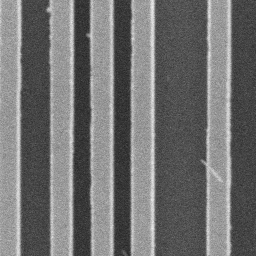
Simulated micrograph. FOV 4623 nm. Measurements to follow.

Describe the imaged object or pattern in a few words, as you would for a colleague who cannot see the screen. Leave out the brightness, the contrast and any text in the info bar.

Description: lines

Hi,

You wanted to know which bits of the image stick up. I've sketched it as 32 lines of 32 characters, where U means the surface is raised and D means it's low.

UUDDDDUUUDDUUUDDDUUDDDDDDDUUUDDD
UUDDDDUUUDDUUUDDDUUDDDDDDDUUUDDD
UUDDDDUUUDDUUUDDDUUDDDDDDDUUUDDD
UUDDDDUUUDDUUUDDUUUDDDDDDDUUUDDD
UUDDDDUUUDDUUUDDUUUDDDDDDDUUUDDD
UUDDDDUUUDDUUUDDDUUDDDDDDDUUUDDD
UUDDDDUUUDDUUUDDDUUDDDDDDDUUUDDD
UUDDDDUUUDDUUUDDUUUDDDDDDDUUUDDD
UUDDDDUUUDDUUUDDUUUDDDDDDDUUUDDD
UUDDDDUUUDDUUUDDUUUDDDDDDDUUUDDD
UUDDDDUUUDDUUUDDUUUDDDDDDDUUUDDD
UUDDDDUUUDDUUUDDUUUDDDDDDDUUUDDD
UUDDDDUUUDDUUUDDUUUDDDDDDDUUUDDD
UUDDDDUUUDDUUUDDUUUDDDDDDDUUUDDD
UUDDDDUUUDDUUUDDUUUDDDDDDDUUUDDD
UUDDDDUUUDDUUUDDUUUDDDDDDDUUUDDD
UUDDDDUUUDDUUUDDUUUDDDDDDDUUUDDD
UUDDDDUUUDDUUUDDUUUDDDDDDDUUUDDD
UUDDDDUUUDDUUUDDUUUDDDDDDDUUUDDD
UUDDDDUUUDDUUUDDUUUDDDDDDDUUUDDD
UUDDDDUUUDDUUUDDUUUDDDDDDDUUUDDD
UUDDDDUUUDDUUUDDUUUDDDDDDDUUUDDD
UUDDDDUUUDDUUUDDUUUDDDDDDDUUUDDD
UUDDDDUUUDDUUUDDUUUDDDDDDDUUUDDD
UUDDDDUUUDDUUUDDUUUDDDDDDDUUUDDD
UUDDDDUUUDDUUUDDUUUDDDDDDDUUUDDD
UUDDDDUUUDDUUUDDUUUDDDDDDDUUUDDD
UUDDDDUUUDDUUUDDUUUDDDDDDDUUUDDD
UUDDDDUUUDDUUUDDUUUDDDDDDDUUUDDD
UUDDDDUUUDDUUUDDUUUDDDDDDDUUUDDD
UUDDDDUUUDDUUUDDUUUDDDDDDDUUUDDD
UUDDDDUUUDDUUUDDUUUDDDDDDDUUUDDD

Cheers